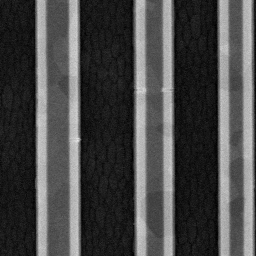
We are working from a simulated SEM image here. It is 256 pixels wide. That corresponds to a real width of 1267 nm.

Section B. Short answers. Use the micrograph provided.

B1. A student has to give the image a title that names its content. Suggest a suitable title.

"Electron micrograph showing one or a few lines or trenches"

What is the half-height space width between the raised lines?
0.297 um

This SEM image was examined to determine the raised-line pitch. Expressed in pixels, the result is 89.1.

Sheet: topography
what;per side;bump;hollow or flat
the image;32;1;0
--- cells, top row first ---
00000111100000000011100000001110
00000111100000000011100000001110
00000111100000000011100000001110
00000111100000000011100000001110
00000111100000000111100000001110
00000111100000000111100000001110
00000111100000000011100000001110
00000111100000000011100000001110
00000111100000000011100000001110
00000111100000000011100000001110
00000111100000000011100000001110
00000111100000000011100000001110
00000111100000000011100000001110
00000111100000000011100000001110
00000111100000000011100000001110
00000111100000000011100000001110
00000111100000000011100000001110
00000111100000000011100000001110
00000111100000000011100000001110
00000111100000000011100000001110
00000111100000000011100000001110
00000111100000000011100000001110
00000111100000000011100000001110
00000111100000000011100000001110
00000111100000000011100000001110
00000111100000000011100000001110
00000111100000000011100000001110
00000111100000000011100000001110
00000111100000000011100000001110
00000111100000000011100000001110
00000111100000000011100000001110
00000111100000000011100000001110